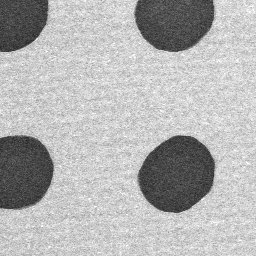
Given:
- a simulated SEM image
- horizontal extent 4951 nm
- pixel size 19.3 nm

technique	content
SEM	holes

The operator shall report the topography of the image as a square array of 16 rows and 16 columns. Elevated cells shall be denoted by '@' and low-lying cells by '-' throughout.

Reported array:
---@@@@@-----@@@
---@@@@@@----@@@
--@@@@@@@---@@@@
@@@@@@@@@@@@@@@@
@@@@@@@@@@@@@@@@
@@@@@@@@@@@@@@@@
@@@@@@@@@@@@@@@@
@@@@@@@@@@@@@@@@
@@@@@@@@@@@-@@@@
---@@@@@@----@@@
---@@@@@@----@@@
---@@@@@@----@@@
--@@@@@@@----@@@
@@@@@@@@@@@@@@@@
@@@@@@@@@@@@@@@@
@@@@@@@@@@@@@@@@